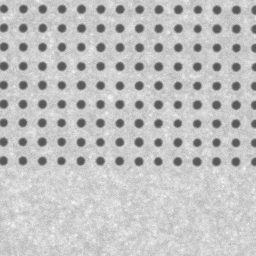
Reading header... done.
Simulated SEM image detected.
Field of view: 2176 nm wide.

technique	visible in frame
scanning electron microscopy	a regular array of holes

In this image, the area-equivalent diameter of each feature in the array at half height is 0.0749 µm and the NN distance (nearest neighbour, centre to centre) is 18.8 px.